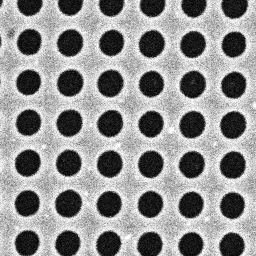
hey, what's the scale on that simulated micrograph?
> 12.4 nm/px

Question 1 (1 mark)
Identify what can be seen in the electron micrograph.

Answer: a regular array of holes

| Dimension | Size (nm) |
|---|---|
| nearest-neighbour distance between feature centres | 496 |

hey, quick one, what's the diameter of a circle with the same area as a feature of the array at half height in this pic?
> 336 nm